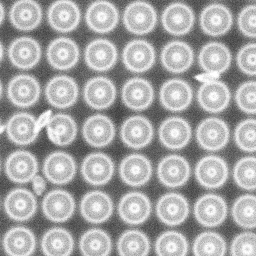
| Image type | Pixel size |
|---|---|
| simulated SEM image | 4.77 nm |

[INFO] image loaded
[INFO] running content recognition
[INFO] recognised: an array of small figures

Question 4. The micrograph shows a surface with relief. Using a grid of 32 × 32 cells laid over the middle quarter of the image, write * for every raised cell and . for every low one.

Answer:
.******....*****.....*****.....*
****************************.***
********************************
********************************
..*****....******..*************
..****......****.....*****....**
...***......***......****......*
...***..**..***...*...***..*...*
..****......***.......***......*
..*****....*****.....****......*
********..*******...******....**
********************************
********************************
.*******..**********************
..****.....*****....******....**
..****......***......****......*
...**...*...***..**...**.......*
..***...*...***..**...**...*...*
..****.....****......****......*
*******....*****....*****.....**
***************************..***
********************************
********************************
.******...*******..********.****
..****.....****.....*****.....**
..***...*...***......***......**
..***...*...***..*...***...*...*
..***......****......***...*...*
.*****.....****.....*****.....**
********.*******...*******...***
********************************
********************************